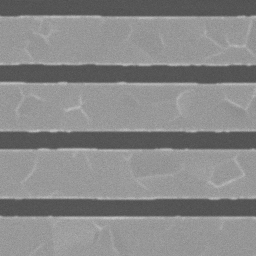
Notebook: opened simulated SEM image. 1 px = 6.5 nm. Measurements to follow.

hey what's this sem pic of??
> lines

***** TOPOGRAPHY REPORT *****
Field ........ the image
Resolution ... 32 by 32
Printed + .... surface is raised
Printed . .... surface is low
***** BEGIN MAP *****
................................
................................
++++++++++++++++++++++++++++++++
++++++++++++++++++++++++++++++++
++++++++++++++++++++++++++++++++
++++++++++++++++++++++++++++++++
++++++++++++++++++++++++++++++++
++++++++++++++++++++++++++++++++
................................
................................
+++++++++++++++++++++++++..+++++
++++++++++++++++++++++++++++++++
++++++++++++++++++++++++++++++++
++++++++++++++++++++++++++++++++
++++++++++++++++++++++++++++++++
++++++++++++++++++++++++++++++++
................................
................................
................................
++++++++++++++++++++++++++++++++
++++++++++++++++++++++++++++++++
++++++++++++++++++++++++++++++++
++++++++++++++++++++++++++++++++
++++++++++++++++++++++++++++++++
++++++++++++++++++++++++++++++++
................................
................................
++++++++++++++++++++++++++++++++
++++++++++++++++++++++++++++++++
++++++++++++++++++++++++++++++++
++++++++++++++++++++++++++++++++
++++++++++++++++++++++++++++++++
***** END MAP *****